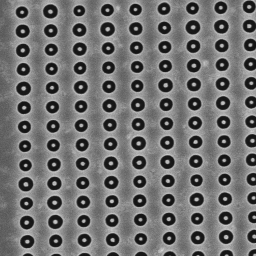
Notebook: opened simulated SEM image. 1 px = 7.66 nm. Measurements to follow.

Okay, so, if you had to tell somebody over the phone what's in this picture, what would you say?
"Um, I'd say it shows a regular array of ring-shaped grooves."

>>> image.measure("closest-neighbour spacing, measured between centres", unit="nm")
145